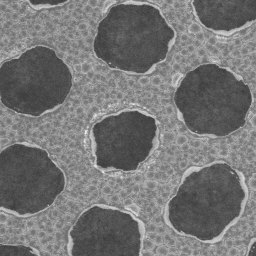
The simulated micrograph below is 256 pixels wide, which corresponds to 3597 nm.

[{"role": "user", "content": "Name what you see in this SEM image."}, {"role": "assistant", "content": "holes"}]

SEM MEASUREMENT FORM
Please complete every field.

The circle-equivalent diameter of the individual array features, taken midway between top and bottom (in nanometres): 1030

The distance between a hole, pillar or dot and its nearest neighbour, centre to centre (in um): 1.39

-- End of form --